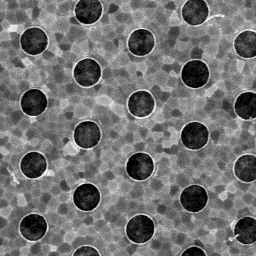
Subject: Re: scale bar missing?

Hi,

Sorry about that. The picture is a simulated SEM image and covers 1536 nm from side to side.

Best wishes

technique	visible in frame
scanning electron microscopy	a regular array of holes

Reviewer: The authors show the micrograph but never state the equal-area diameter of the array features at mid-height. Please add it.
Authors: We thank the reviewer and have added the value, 167 nanometers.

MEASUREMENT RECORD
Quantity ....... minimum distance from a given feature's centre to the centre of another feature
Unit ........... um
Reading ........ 0.369